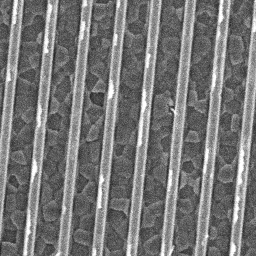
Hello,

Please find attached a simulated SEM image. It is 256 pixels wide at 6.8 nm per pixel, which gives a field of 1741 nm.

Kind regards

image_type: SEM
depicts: parallel lines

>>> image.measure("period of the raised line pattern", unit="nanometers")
233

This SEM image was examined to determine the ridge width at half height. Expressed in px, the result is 9.59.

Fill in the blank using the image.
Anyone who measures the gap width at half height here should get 172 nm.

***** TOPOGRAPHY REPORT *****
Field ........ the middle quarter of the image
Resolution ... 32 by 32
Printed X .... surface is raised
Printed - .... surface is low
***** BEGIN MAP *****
---XX-------XX------XXX------XX-
---XX-------XX------XX-------XX-
---XX-------XX------XX-------XX-
---XX-------XX------XX-------XX-
---XX------XXX------XX-------XX-
---XX------XXX------XX-------XX-
---XX------XX-------XX-------XX-
---XX------XX-------XX------XXX-
---XX------XX-------XX------XXX-
--XX-------XX------XXX------XX--
--XX-------XX------XXX------XX--
--XX-------XX------XXX------XX--
--XX-------XX------XX-------XX--
--XX-------XX------XX-------XX--
--XX------XXX------XX-------XX--
--XX------XXX------XX------XXX--
--XX------XX-------XX------XXX--
--XX------XX-------XX------XXX--
--XX------XX-------XX------XXX--
-XX-------XX------XXX------XX---
-XX-------XX------XXX------XX---
-XX-------XX------XXX------XX---
-XX-------XX------XX-------XX---
-XX-------XX------XX-------XX---
-XX------XXX------XX-------XX---
-XX------XXX------XX------XXX---
-XX------XX-------XX-------XX---
-XX------XX-------XX------XXX---
-XX------XX-------XX------XXX---
XX-------XX------XXX------XX----
XX-------XX------XXX------XX----
XX-------XX------XXX------XX----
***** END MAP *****